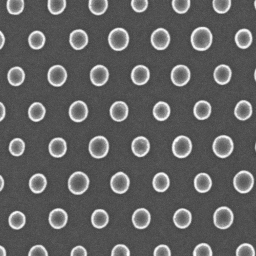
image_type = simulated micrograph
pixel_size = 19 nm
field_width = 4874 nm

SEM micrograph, a regular array of raised bodies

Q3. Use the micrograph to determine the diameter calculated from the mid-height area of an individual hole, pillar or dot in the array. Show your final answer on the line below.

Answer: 0.351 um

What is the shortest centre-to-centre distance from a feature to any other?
0.779 µm